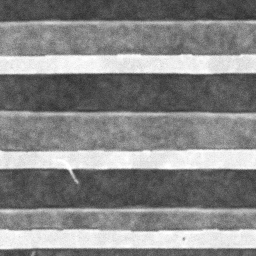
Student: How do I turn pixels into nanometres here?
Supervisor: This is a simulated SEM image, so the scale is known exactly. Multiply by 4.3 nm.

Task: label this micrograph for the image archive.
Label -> lines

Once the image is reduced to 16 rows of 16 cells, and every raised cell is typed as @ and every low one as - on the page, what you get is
----------------
@@@@@@@@@@@@@@@@
@@@@@@@@@@@@@@@@
@@@@@@@@@@@@@@@@
@@@@@@@@@@@@@@@@
----------------
----------------
@@@@@@@@@@@@@@@@
@@@@@@@@@@@@@@@@
@@@@@@@@@@@@@@@@
@@-@@@@@@@@@@@@@
----------------
----------------
@@@@@@@@@@@@@@@@
@@@@@@@@@@@@@@@@
@---------------